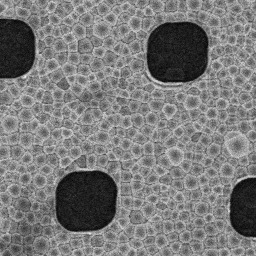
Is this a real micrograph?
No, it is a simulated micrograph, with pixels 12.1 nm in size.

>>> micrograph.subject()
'holes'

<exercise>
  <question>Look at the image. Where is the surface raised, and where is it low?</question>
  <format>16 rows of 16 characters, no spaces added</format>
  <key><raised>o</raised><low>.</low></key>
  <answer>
oooooooooooooooo
..oooooooo..oooo
..ooooooo....ooo
..ooooooo....ooo
..ooooooo....ooo
oooooooooooooooo
oooooooooooooooo
oooooooooooooooo
oooooooooooooooo
oooooooooooooooo
oooooooooooooooo
oooo...oooooooo.
ooo....ooooooo..
oooo...ooooooo..
ooooooooooooooo.
oooooooooooooooo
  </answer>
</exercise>